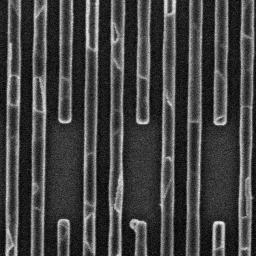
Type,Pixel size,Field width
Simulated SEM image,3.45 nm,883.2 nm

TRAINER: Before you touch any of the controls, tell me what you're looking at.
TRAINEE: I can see wiring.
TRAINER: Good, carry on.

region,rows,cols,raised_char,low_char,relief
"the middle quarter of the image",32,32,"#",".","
##....##....###....##....###...#
##....##....###...###....###...#
##....##....###...###....###...#
##....##....###...###....###...#
##....##....###...###....###...#
##....##....###...###....###...#
##...###....###...###....###...#
##...###....###...###....###...#
##...###....##....###....##....#
##...###....##....###....##....#
##...###....##....###....##....#
##...###....##....###....##....#
##...###....###...###....##....#
##...###....###...###....##....#
#....###....###....##....##....#
.....###....###..........##....#
.....###....###..........##....#
.....###....###..........##....#
.....###....###..........##....#
.....###....##...........##....#
.....###....##...........##....#
.....###....##...........##....#
.....###....##...........##....#
.....###....##...........##....#
.....###....##...........##....#
.....###....##...........##....#
.....###....##...........##....#
.....###....##...........##....#
.....###....##...........##....#
.....###....###.........###....#
.....###...####.........###....#
.....###...####.........###....#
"